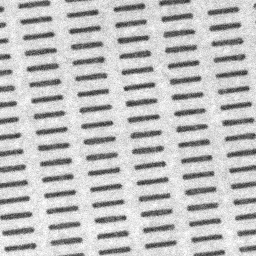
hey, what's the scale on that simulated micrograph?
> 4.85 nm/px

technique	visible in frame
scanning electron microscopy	a regular array of holes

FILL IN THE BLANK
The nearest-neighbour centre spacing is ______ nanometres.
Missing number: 76.8